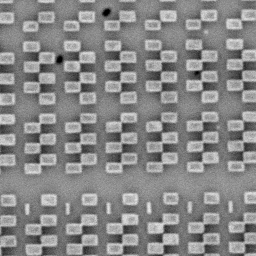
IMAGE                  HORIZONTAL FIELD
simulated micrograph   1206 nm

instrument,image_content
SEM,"wiring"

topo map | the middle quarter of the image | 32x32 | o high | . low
oooo......oooo.......ooo.......o
oooo......oooo.......ooo........
....oooo......oooo.......ooo....
....oooo......oooo.......ooo....
....oooo......oooo...oooo......o
oooo.......ooo.......ooo.......o
oooo.......ooo.......ooo.......o
....oooo......oooo.......ooo....
....oooo......oooo.......ooo....
....oooo......oooo.......ooo....
................................
................................
.........................ooo....
....oooo......oooo.......ooo....
....oooo......oooo.............o
.ooo.......ooo.......ooo.......o
.ooo.......ooo.......ooo.......o
................oo.......ooo....
....oooo......oooo.......ooo....
....oooo......oooo......oooo....
.ooo.......ooo.......ooo.......o
.ooo.......ooo.......ooo.......o
.........................ooo....
....oooo......oooo.......ooo....
....oooo......oooo......oooo....
.ooo.......ooo.......ooo.......o
.ooo.......ooo.......ooo.......o
................................
................................
................................
................................
................................